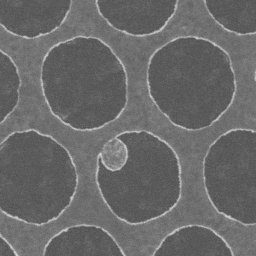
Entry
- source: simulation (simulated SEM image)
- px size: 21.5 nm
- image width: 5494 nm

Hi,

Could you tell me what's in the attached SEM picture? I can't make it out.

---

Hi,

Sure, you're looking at holes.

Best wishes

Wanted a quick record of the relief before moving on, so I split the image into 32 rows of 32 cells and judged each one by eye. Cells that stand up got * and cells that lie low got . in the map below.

.........***..........****......
........*****.........****......
........*****........******.....
*......*******......********....
***..***************************
********.....********......*****
******........******........****
.*****.........****..........***
..***..........****..........***
..***...........***..........***
..***...........***..........***
..****..........***..........***
..****..........***..........***
..****.........*****........****
.******........******......*****
*********....*********....******
***.*************.***********...
*......********.....*******.....
*.......********.....*****......
.........*******......****......
.........***.***......****......
.........***..........***.......
..........**..........****......
.........***...........***......
.........****.........****......
.........****.........*****.....
*.......******.......*******....
***...**********...***********..
*********...***********...******
*******.......*******......*****
.*****.........*****........****
..****.........****..........***